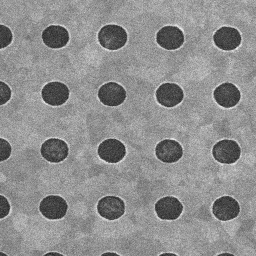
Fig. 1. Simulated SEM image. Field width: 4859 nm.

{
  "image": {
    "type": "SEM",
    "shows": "a regular array of holes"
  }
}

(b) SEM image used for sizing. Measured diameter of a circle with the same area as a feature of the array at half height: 26.5 px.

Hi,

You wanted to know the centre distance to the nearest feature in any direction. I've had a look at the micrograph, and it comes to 56.7 pixels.